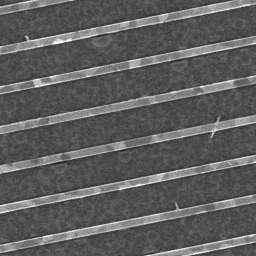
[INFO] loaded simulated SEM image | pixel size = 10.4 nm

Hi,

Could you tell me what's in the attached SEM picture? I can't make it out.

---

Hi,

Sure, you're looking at parallel lines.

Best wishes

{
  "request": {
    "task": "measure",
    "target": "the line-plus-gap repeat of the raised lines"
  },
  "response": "405 nanometers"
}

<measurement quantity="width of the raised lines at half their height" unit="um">0.0778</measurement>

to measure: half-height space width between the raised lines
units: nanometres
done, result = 325